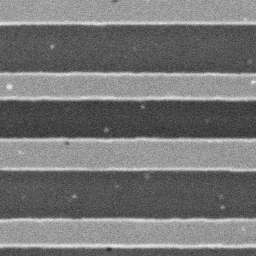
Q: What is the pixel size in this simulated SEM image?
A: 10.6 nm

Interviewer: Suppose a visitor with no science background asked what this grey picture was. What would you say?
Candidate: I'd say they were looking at lines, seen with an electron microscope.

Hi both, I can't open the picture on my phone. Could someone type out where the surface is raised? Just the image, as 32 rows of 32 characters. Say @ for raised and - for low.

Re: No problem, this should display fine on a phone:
@@@@@@@@@@@@@@@@@@@@@@@@@@@@@@@@
@@@@@@@@@@@@@@@@@@@@@@@@@@@@@@@@
@@@@@@@@@@@@@@@@@@@@@@@@@@@@@@@@
--------------------------------
--------------------------------
--------------------------------
--------------------------------
--------------------------------
--------------------------------
@@@@@@@@@@@@@@@@@@@@@@@@@@@@@@@@
@@@@@@@@@@@@@@@@@@@@@@@@@@@@@@@@
@@@@@@@@@@@@@@@@@@@@@@@@@@@@@@@@
--------------------------------
--------------------------------
--------------------------------
--------------------------------
--------------------------------
-----------------@@@------------
@@@@@@@@@@@@@@@@@@@@@@@@@@@@@@@@
@@@@@@@@@@@@@@@@@@@@@@@@@@@@@@@@
@@@@@@@@@@@@@@@@@@@@@@@@@@@@@@@@
--------------------------------
--------------------------------
--------------------------------
--------------------------------
--------------------------------
--------------------------------
-@@@@@@@@@@@@@@@@----@@@@@--@@@@
@@@@@@@@@@@@@@@@@@@@@@@@@@@@@@@@
@@@@@@@@@@@@@@@@@@@@@@@@@@@@@@@@
@@@@@@@@@@@@@@@@@@@@@@@@@@@@@@@@
--------------------------------